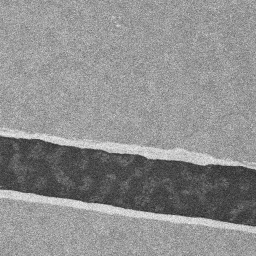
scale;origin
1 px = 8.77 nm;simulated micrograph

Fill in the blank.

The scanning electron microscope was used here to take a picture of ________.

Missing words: one or a few lines or trenches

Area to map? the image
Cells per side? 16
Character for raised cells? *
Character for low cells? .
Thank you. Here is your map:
****************
****************
****************
****************
****************
****************
****************
****************
.***************
.........*******
................
................
****............
**********......
****************
****************